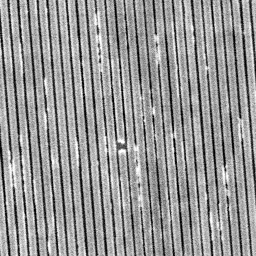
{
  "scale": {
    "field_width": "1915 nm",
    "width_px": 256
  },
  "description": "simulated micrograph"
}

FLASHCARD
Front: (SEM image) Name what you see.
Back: parallel lines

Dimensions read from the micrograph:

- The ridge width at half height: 0.0531 micrometres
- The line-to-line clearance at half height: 19.6 nanometres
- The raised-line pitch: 72.1 nm